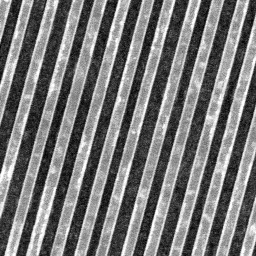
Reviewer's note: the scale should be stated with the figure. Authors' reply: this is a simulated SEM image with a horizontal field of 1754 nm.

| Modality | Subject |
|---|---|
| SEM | parallel lines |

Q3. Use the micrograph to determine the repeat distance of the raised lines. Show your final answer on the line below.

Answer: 157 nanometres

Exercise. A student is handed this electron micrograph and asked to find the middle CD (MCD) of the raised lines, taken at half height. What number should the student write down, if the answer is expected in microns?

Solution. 0.0728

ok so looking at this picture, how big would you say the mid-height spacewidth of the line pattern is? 84.4 nm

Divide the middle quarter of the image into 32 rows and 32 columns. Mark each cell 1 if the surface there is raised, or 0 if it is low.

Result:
10011100011100011100011000011100
00011100011100011100111000011100
00011100011100011100111000011000
00011000111000011000111000111000
00111000111000111000110000111000
00111000111000111001110000110001
00111000111000111001110001110001
01110001110000110001100001110001
01110001110001110001100001110001
01110001110001110011100001100011
01110001100001100011000011100011
11100011100011100011000011100011
11100011100011100111000011100011
11100011100011100111000011000111
11000011000011000110000111000111
11000111000111000110000111000110
11000111000111001110000110000110
11000111000111001110000110001110
10001110000110001100001110001110
10001110001110001100001110001100
10001110001110011100001100011100
10001100001100011100011100011100
00011100001100011000011100011100
00011100011100011000011100011000
00011100011100111000011000111000
00011000011000111000111000111000
00111000111000110000111000111000
00111000111001110000111000110000
00110000111001110000110001110001
00110000110001110001110001110001
01110001110001100001110001100001
01110001110011100001100011100001